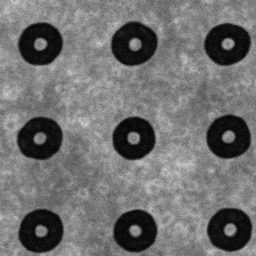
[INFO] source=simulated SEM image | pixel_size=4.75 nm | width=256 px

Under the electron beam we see a regular array of ring-shaped grooves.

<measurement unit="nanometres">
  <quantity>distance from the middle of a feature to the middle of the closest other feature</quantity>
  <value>440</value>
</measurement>